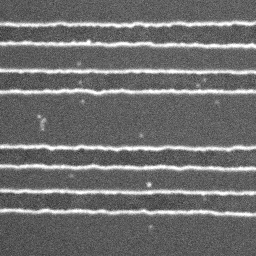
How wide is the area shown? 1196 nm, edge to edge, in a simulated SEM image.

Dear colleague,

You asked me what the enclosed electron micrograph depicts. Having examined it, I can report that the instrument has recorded lines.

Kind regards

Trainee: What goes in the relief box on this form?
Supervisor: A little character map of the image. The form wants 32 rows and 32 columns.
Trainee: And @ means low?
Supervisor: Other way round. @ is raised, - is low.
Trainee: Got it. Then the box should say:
@@@@@@@@@@@@@@@@@@@@@@@@@@@@@@@@
@@@@@@@@@@@@@@@@@@@@@@@@@@@@@@@@
@@@@@@@@@@@@@@@@@@@@@@@@@@@@@@@@
--------------------------------
--------------------------------
@@@@@@@@@@@@@-@@-@@-------------
@@@@@@@@@@@@@@@@@@@@@@@@@@@@@@@@
@@@@@@@@@@@@@@@@@@@@@@@@@@@@@@@@
@@@@@@@@@@@@@@@@@@@@@@@@@@@@@@@@
--------------------------------
--------------------------------
@@@@@@@@@@@@@@@@@@@@@@@@@@@@@@@@
@@@@@@@@@@@@@@@@@@@@@@@@@@@@@@@@
@@@@@@@@@@@@@@@@@@@@@@@@@@@@@@@@
@@@@@@@@@@@@@@@@@@@@@@@@@@@@@@@@
@@@@@@@@@@@@@@@@@@@@@@@@@@@@@@@@
@@@@@@@@@@@@@@@@@@@@@@@@@@@@@@@@
@@@@@@@@@@@@@@@@@@@@@@@@@@@@@@@@
------@@@@-@@@@@@@@@@@@@@@@@@@@@
--------------------------------
--------------------------------
@@@@@@@@@@@@@@@@@@@@@@@@@@@@@@@@
@@@@@@@@@@@@@@@@@@@@@@@@@@@@@@@@
@@@@@@@@@@@@@@@@@@@@@@@@@@@@@@@@
--------------------------------
--------------------------------
@@@@@@@@@@@@@@@@@@@@@@@@@@@-----
@@@@@@@@@@@@@@@@@@@@@@@@@@@@@@@@
@@@@@@@@@@@@@@@@@@@@@@@@@@@@@@@@
@@@@@@@@@@@@@@@@@@@@@@@@@@@@@@@@
@@@@@@@@@@@@@@@@@@@@@@@@@@@@@@@@
@@@@@@@@@@@@@@@@@@@@@@@@@@@@@@@@